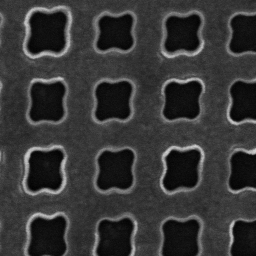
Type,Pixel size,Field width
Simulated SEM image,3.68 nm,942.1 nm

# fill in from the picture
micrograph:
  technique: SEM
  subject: a regular array of holes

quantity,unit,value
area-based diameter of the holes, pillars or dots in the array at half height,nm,155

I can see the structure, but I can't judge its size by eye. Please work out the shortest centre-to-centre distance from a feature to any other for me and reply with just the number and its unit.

0.246 um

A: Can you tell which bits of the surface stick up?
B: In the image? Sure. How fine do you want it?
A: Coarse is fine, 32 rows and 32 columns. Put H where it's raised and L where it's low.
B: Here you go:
HHHHHHHHHHHHHHHHHHHHHHHHHHHHHHHH
HHHHLLLLHHHHHHHHHHHHHHHHHHHHHHHH
HHHHLLLLLHHHLLLLLHHHHLLLLHHHHLLL
HHHHLLLLHHHHLLLLLHHHHLLLLHHHHLLL
HHHHLLLLHHHHLLLLLHHHHLLLLHHHHLLL
HHHLLLLLHHHHLLLLLHHHLLLLLHHHHLLL
HHHLLLLLHHHHHHHHHHHHHLLLHHHHHLLL
HHHHHHHHHHHHHHHHHHHHHHHHHHHHHHHH
HHHHHHHHHHHHHHHHHHHHHHHHHHHHHHHH
HHHHHHHHHHHHHHHHHHHHHHHHHHHHHHHH
HHHHLLLLHHHHLLLLLHHHHLLLLHHHHLLL
HHHHLLLLHHHHLLLLLHHHHLLLLHHHHLLL
HHHHLLLLHHHHLLLLHHHHHLLLLHHHHLLL
HHHHLLLLHHHHLLLLHHHHLLLLLHHHHLLL
HHHHLLLLHHHHLLLLHHHHLLLLLHHHHLLL
HHHHHHHHHHHHHHHHHHHHHHHHHHHHHHHH
HHHHHHHHHHHHHHHHHHHHHHHHHHHHHHHH
HHHHHHHHHHHHHHHHHHHHHHHHHHHHHHHH
HHHHHHHHHHHHHHHHHHHHHHHHHHHHHHHH
HHHHLLLLHHHHLLLLLHHHHLLLLHHHHLLL
HHHHLLLLHHHHLLLLLHHHHLLLLHHHHLLL
HHHLLLLLHHHHLLLLLHHHHLLLLHHHHLLL
HHHLLLLLHHHHLLLLLHHHLLLLLHHHHLLL
HHHLLLLHHHHHLLLLHHHHHLLLHHHHHLHH
HHHHHHHHHHHHHHHHHHHHHHHHHHHHHHHH
HHHHHHHHHHHHHHHHHHHHHHHHHHHHHHHH
HHHHHHHHHHHHHHHHHHHHHHHHHHHHHHHH
HHHHLLLLHHHHHLLLLHHHHLHLLHHHHHHH
HHHHLLLLHHHHLLLLLHHHLLLLLHHHHLLL
HHHHLLLLHHHHLLLLLHHHLLLLLHHHHLLL
HHHHLLLLHHHHLLLLHHHHLLLLLHHHHLLL
HHHLLLLLHHHHLLLLHHHHLLLLLHHHHLLL